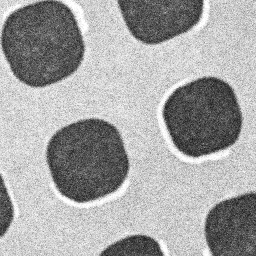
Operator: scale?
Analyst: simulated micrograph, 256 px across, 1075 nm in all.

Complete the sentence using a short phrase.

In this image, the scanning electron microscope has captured holes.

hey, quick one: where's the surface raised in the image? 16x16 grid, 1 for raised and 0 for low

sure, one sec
1000111000000111
0000011100001111
0000011110011111
0000011111111111
1000011111111111
1111111111100011
1111111111000001
1111101111000001
1110000011100001
1110000011100111
1110000011111111
1110000011111111
0111001111111100
0111111111111000
1111111111111000
1111111000111000